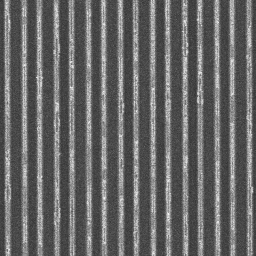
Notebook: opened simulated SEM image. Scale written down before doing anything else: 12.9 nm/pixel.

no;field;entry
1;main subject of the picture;parallel lines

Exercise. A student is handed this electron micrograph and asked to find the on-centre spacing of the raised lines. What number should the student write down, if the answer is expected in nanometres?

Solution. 208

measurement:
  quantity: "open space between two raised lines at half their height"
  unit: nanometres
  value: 140